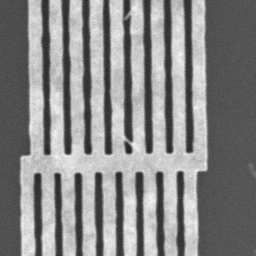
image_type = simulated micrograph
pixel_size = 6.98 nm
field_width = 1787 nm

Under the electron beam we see groups of lines, slits or small figures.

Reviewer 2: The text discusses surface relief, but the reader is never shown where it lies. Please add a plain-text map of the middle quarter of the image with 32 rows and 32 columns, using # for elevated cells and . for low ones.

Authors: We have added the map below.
..###..###..###..###..###..###..
..###..###..###..###..###..###..
..###..###..###..###..###..###..
..##...###..###..###..###..###..
..##...###..###..###..###..###..
..##...###..###..###..###..###..
..##...###..###..###..###..###..
..##...###..###..###..###..###..
..###..###..###..###..###..###..
..###..###..###..###..###..###..
..###..###..###..###..###..###..
..###..###..###..###..###..###..
..###..###..###..###..###..###..
..###..###..###..###..###..###..
..###..###..###..###...##...##..
..###..###..###..###...##...##..
..###..###..###..###...##...##..
..###..###..###..###...##...##..
..###..###..###..###...##..###..
..###..###..###..###...##..###..
..###..###..###..###...##..###..
..###..###..###..###...##...##..
..###..###..###..###..####.####.
################################
################################
################################
#############################.##
##..###...##...###..###..###..##
##...##...##...###..###..###..##
##...##...###..###..###..###..##
##...##...##...###..###..###..##
##...##...###..###..###..###..##